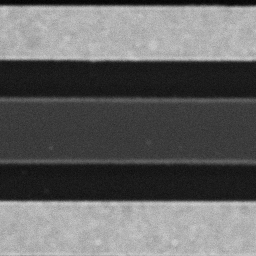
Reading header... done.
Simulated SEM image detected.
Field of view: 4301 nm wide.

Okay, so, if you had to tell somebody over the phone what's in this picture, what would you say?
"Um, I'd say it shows lines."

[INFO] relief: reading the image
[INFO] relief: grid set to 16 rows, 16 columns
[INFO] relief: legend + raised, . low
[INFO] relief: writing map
++++++++++++++++
++++++++++++++++
++++++++++++++++
++++++++++++++++
................
................
++++++++++++++++
++++++++++++++++
++++++++++++++++
++++++++++++++++
................
................
................
++++++++++++++++
++++++++++++++++
++++++++++++++++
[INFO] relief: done